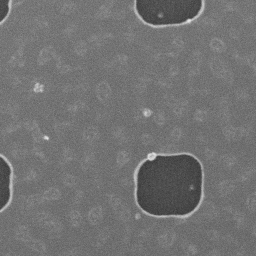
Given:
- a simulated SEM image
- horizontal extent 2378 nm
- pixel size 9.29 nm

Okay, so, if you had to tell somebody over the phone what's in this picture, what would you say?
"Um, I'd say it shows holes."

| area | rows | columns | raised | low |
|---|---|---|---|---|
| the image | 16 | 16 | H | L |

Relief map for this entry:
LHHHHHHHHLLLLHHH
HHHHHHHHHLLHHHHH
HHHHHHHHHHHHHHHH
HHHHHHHHHHHHHHHH
HHHHHHHHHHHHHHHH
HHHHHHHHHHHHHHHH
HHHHHHHHHHHHHHHH
HHHHHHHHHHHHHHHH
HHHHHHHHHHHHHHHH
HHHHHHHHHHHHHHHH
LHHHHHHHHLLLLHHH
LHHHHHHHHLLLLHHH
LHHHHHHHHLLLHHHH
HHHHHHHHHHHHHHHH
HHHHHHHHHHHHHHHH
HHHHHHHHHHHHHHHH